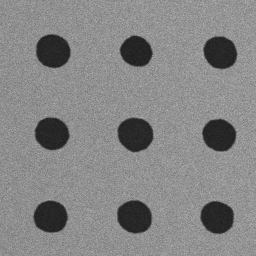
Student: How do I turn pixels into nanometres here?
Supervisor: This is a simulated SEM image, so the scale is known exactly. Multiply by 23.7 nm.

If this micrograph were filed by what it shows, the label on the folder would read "a regular array of holes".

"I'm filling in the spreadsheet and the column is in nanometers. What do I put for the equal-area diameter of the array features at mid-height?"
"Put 788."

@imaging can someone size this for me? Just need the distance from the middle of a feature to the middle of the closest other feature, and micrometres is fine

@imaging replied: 1.95